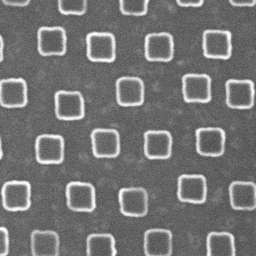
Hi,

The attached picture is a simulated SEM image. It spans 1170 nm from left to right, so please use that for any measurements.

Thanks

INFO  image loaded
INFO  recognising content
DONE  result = a regular array of raised bodies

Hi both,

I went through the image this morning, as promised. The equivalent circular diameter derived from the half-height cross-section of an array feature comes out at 141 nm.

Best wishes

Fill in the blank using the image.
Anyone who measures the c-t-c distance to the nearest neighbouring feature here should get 231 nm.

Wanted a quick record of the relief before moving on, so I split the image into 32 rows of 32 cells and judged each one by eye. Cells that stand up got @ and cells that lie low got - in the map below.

-@@----@@@@----@@@----@@@----@@@
--------@@-----@@@--------------
--------------------------------
-----@@-------------------------
-----@@@---@@@-----@@----@@@@---
-----@@@---@@@----@@@@---@@@@---
-----@@@---@@@----@@@@----@@@---
-----------@@@------@-----------
--------------------------------
-----------------------@@@------
@@@------------@@@-----@@@--@@@@
@@@----@@------@@@-----@@@--@@@@
@@@----@@@-----@@@-----@@@--@@@@
-------@@@-------------------@@-
-------@@@----------------------
--------------------------------
------------@@-----@@----@@@----
-----@@@----@@@---@@@----@@@----
----@@@@----@@@---@@@----@@@----
-----@@@----@@----@@@-----------
--------------------------------
--------------------------------
----------------------@@@@------
@@@@----@@@@----------@@@@---@@@
@@@@----@@@@---@@@----@@@@---@@@
@@@@----@@@@---@@@-----------@@@
---------------@@@--------------
--------------------------------
--------------------------------
@---@@@----@@@----@@@-----@@@---
@---@@@----@@@----@@@-----@@@---
@---@@@----@@@----@@@-----@@@---